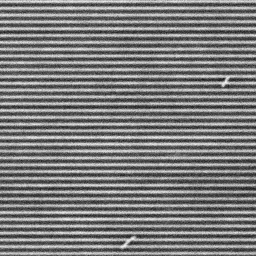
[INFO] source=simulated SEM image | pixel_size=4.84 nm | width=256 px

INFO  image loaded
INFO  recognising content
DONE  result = parallel lines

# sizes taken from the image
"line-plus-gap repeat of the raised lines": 33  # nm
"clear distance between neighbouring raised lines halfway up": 23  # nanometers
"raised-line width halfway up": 4.2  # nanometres